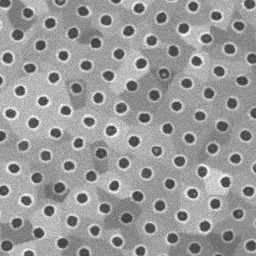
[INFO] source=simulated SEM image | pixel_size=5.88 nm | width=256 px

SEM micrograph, a regular array of holes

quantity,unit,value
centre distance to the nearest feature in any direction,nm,142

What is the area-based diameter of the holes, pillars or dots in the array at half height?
67.9 nanometres